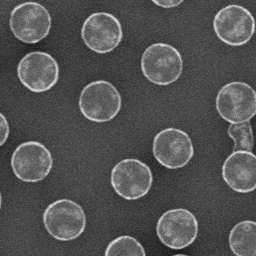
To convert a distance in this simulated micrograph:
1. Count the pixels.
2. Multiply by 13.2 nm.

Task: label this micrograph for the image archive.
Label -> a regular array of raised bodies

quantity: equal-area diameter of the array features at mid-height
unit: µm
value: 0.522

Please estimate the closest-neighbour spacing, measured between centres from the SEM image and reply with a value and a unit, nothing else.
875 nm